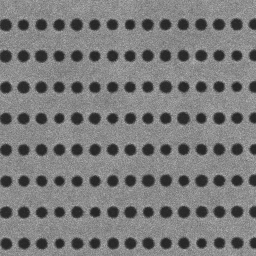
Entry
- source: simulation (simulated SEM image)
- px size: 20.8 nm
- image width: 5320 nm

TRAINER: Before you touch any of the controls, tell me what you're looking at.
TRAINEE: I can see a regular array of holes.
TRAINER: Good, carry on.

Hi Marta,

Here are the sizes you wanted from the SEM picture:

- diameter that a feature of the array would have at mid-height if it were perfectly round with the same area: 0.26 um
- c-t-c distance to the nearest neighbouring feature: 17.6 px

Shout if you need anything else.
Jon